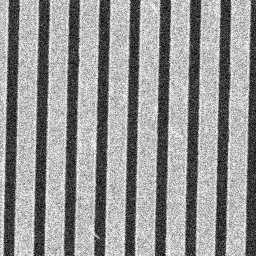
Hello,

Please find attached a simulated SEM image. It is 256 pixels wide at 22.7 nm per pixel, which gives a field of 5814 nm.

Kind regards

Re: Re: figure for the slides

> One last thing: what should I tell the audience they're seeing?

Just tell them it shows parallel lines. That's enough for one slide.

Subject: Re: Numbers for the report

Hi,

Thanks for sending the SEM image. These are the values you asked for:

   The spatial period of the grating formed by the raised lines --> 0.687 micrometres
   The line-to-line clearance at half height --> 12.7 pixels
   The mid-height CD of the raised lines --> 388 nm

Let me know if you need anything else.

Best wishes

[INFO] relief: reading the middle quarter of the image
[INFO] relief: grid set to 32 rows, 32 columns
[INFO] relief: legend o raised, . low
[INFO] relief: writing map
o...oooo....oooo...oooo....oooo.
o...oooo...ooooo...oooo....oooo.
o...oooo...ooooo...oooo....oooo.
o...oooo...ooooo...oooo....oooo.
o...oooo...ooooo...oooo....oooo.
o...oooo....oooo...oooo....oooo.
o...oooo....oooo...oooo....oooo.
....oooo...ooooo...oooo....oooo.
....oooo...ooooo...oooo....oooo.
....oooo...ooooo...oooo...ooooo.
....oooo...ooooo...oooo...ooooo.
....oooo...ooooo...oooo...ooooo.
....oooo...oooo....oooo....oooo.
....oooo...oooo....oooo....oooo.
....oooo...oooo....oooo....oooo.
....oooo...oooo....oooo...ooooo.
....oooo...oooo....oooo...ooooo.
....oooo...oooo....oooo...oooo..
....oooo...oooo....oooo...ooooo.
....oooo...oooo....oooo...oooo..
....oooo...oooo....oooo...oooo..
....oooo...oooo....oooo...oooo..
....oooo...oooo....oooo...oooo..
....oooo...oooo....oooo...oooo..
....oooo...oooo....oooo...oooo..
....oooo...oooo....oooo...oooo..
....oooo...oooo....oooo...oooo..
...ooooo...oooo....oooo...oooo..
...ooooo...oooo....oooo...oooo..
...ooooo...oooo....oooo...oooo..
...oooo....oooo....oooo...oooo..
...oooo....oooo....oooo...oooo..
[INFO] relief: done